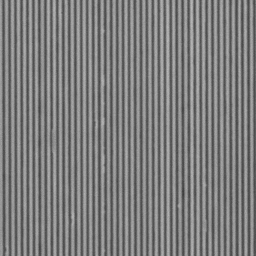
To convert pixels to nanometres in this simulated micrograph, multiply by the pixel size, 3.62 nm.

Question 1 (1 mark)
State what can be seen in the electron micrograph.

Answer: parallel lines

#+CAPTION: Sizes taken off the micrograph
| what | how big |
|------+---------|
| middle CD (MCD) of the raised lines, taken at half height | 9.5 nanometres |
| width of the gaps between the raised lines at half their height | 0.0122 microns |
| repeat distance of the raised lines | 5.97 pixels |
